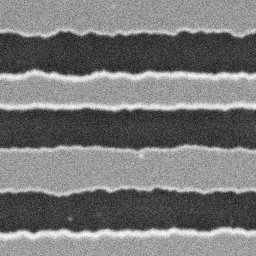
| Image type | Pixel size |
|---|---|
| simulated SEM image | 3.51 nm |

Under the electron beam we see lines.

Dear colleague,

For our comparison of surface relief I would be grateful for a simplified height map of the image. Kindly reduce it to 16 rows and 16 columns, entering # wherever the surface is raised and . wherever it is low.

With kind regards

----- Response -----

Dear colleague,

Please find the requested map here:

################
################
................
................
..#...#..#......
################
################
................
................
################
################
################
................
................
.###############
################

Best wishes